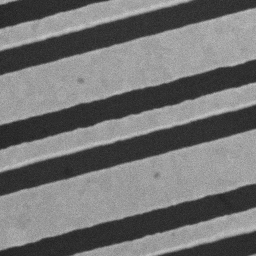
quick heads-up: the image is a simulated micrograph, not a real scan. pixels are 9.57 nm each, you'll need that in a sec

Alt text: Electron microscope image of lines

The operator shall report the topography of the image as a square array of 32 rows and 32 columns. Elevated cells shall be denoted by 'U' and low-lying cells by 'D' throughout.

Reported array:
DDDDDDDDDDDDUUUUUUUUUUDDDDDDDDDD
DDDDDDDDUUUUUUUUUUDDDDDDDDDDDDUU
DDDDDUUUUUUUUUUDDDDDDDDDDDUUUUUU
UUUUUUUUUUUDDDDDDDDDDDDUUUUUUUUU
UUUUUUUDDDDDDDDDDDDUUUUUUUUUUUUU
UUUDDDDDDDDDDDDUUUUUUUUUUUUUUUUU
DDDDDDDDDDDUUUUUUUUUUUUUUUUUUUUU
DDDDDDDUUUUUUUUUUUUUUUUUUUUUUUUD
DDDUUUUUUUUUUUUUUUUUUUUUUUUDDDDD
UUUUUUUUUUUUUUUUUUUUUUUUDDDDDDDD
UUUUUUUUUUUUUUUUUUUUDDDDDDDDDDDU
UUUUUUUUUUUUUUUUDDDDDDDDDDDUUUUU
UUUUUUUUUUUUDDDDDDDDDDDDUUUUUUUU
UUUUUUUUDDDDDDDDDDDDUUUUUUUUUUUD
UUUUDDDDDDDDDDDDUUUUUUUUUUDDDDDD
UDDDDDDDDDDDUUUUUUUUUUUDDDDDDDDD
DDDDDDDDUUUUUUUUUUUDDDDDDDDDDDDU
DDDDDUUUUUUUUUUDDDDDDDDDDDDUUUUU
DUUUUUUUUUUDDDDDDDDDDDDUUUUUUUUU
UUUUUUUUDDDDDDDDDDDDUUUUUUUUUUUU
UUUUDDDDDDDDDDDUUUUUUUUUUUUUUUUU
DDDDDDDDDDDDUUUUUUUUUUUUUUUUUUUU
DDDDDDDDUUUUUUUUUUUUUUUUUUUUUUUU
DDDDUUUUUUUUUUUUUUUUUUUUUUUUUUDD
UUUUUUUUUUUUUUUUUUUUUUUUUUDDDDDD
UUUUUUUUUUUUUUUUUUUUUUDDDDDDDDDD
UUUUUUUUUUUUUUUUUUUDDDDDDDDDDDUU
UUUUUUUUUUUUUUDDDDDDDDDDDDUUUUUU
UUUUUUUUUUUDDDDDDDDDDDUUUUUUUUUU
UUUUUUUDDDDDDDDDDDUUUUUUUUUUUDDD
UUUDDDDDDDDDDDDUUUUUUUUUUDDDDDDD
DDDDDDDDDDUUUUUUUUUUUDDDDDDDDDDD